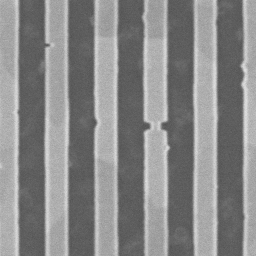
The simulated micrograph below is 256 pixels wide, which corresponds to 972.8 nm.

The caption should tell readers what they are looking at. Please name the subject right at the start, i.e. parallel lines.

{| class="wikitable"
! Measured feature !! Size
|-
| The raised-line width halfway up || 75.6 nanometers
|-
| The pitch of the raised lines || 0.189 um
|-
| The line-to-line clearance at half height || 112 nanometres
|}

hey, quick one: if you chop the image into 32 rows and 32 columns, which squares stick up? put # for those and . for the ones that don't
##....##....##....###...###....#
##....##....##....###....##....#
##....##....##....###....##....#
##....##....##....###....##....#
##....##....##....###....##....#
##....##....##....###....##....#
##....##....##....###....##....#
##....##....##....###....##....#
##....##....##....###....##...##
##....##....##....###...###....#
##....##....##....###...###...##
##....##....##....###...###....#
##....##....##....###...###....#
##....##....##....###...###....#
##....##....##....###...###....#
##....##....##.....#.....##....#
##....##....##.....#.....##....#
##....##....##....###....##....#
##....##....##....###....##....#
##....##....##....###....##....#
##....##....##....###...###....#
##....##....##....###...###....#
##....##....##....###...###....#
##....##....##....###...###....#
##....##....##....###...###....#
##....##....##....###...###....#
##....##....##....###...###....#
##....##....##....###...###....#
##....##....##....###...###....#
##....##....##....###...###....#
##....##....##....###...###....#
##....##....##....###...###....#